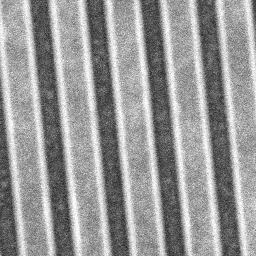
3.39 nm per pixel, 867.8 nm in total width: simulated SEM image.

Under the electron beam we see parallel lines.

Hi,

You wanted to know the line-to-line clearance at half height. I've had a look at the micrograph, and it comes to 24.2 px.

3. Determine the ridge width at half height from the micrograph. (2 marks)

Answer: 107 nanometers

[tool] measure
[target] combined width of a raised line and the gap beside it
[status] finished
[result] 55.1 pixels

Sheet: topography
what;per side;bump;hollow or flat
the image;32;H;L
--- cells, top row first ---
HHHLLLHHHHLLLHHHHLLLHHHHLLLHHHHL
HHHLLLLHHHHLLHHHHLLLHHHHLLLHHHHL
HHHHLLLHHHHLLLHHHLLLHHHHLLLHHHHL
HHHHLLLHHHHLLLHHHHLLLHHHHLLLHHHL
HHHHLLLHHHHLLLHHHHLLLHHHHLLLHHHH
HHHHLLLHHHHLLLHHHHLLLHHHHLLLHHHH
HHHHLLLHHHHLLLHHHHLLLHHHHLLLHHHH
HHHHLLLHHHHLLLHHHHLLLHHHHLLLHHHH
HHHHLLLHHHHLLLHHHHLLLHHHHLLLHHHH
HHHHLLLHHHHLLLHHHHLLLHHHHLLLHHHH
LHHHLLLHHHHLLLHHHHLLLHHHHLLLHHHH
LHHHHLLLHHHHLLHHHHLLLHHHHLLLHHHH
LHHHHLLLHHHHLLLHHHLLLLHHHLLLLHHH
LHHHHLLLHHHHLLLHHHHLLLHHHHLLLHHH
LHHHHLLLHHHHLLLHHHHLLLHHHHLLLHHH
LHHHHLLLHHHHLLLHHHHLLLHHHHLLLHHH
LHHHHLLLHHHHLLLHHHHLLLHHHHLLLHHH
LHHHHLLLHHHHLLLHHHHLLLHHHHLLLHHH
LHHHHLLLHHHHLLLHHHHLLLHHHHLLLHHH
LHHHHLLLHHHHLLLHHHHLLLHHHHLLLHHH
LLHHHLLLLHHHLLLHHHHLLLHHHHLLLHHH
LLHHHHLLLHHHHLLLHHHLLLHHHHLLLHHH
LLHHHHLLLHHHHLLLHHHHLLLHHHLLLLHH
LLHHHHLLLHHHHLLLHHHHLLLHHHHLLLHH
LLHHHHLLLHHHHLLLHHHHLLLHHHHLLLHH
LLHHHHLLLHHHHLLLHHHHLLLHHHHLLLHH
LLHHHHLLLHHHHLLLHHHHLLLHHHHLLLHH
LLHHHHLLLHHHHLLLHHHHLLLHHHHLLLHH
LLHHHHLLLHHHHLLLHHHHLLLHHHHLLLHH
LLHHHHLLLHHHHLLLHHHHLLLHHHHLLLHH
LLLHHHLLLLHHHLLLHHHHLLLHHHHLLLHH
LLLHHHHLLLHHHHLLLHHHLLLHHHHLLLHH